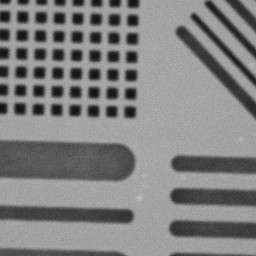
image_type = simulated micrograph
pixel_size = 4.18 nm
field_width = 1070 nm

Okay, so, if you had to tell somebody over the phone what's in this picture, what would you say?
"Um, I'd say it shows groups of lines, slits or small figures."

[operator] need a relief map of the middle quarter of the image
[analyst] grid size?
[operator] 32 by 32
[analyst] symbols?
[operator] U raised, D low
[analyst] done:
UUUUUUUUUUUUUUUUUUUUUUUUUUUUUUUU
UDDDDUDDDUUDDUUUDDUUUUUUUUUUUUUU
UDDDDUDDDUUDDDUDDDUUUUUUUUUUUUUU
UUDDUUDDDUUDDDUDDDUUUUUUUUUUUUUU
UUUUUUUUUUUUUUUUUUUUUUUUUUUUUUUU
UUDUUUUUUUUUUUUUUUUUUUUUUUUUUUUU
UDDDUUDDDUDDDDUDDDUUUUUUUUUUUUUU
UDDDUUDDDUDDDDUDDDUUUUUUUUUUUUUU
UUDDUUDDUUUDDUUDDDUUUUUUUUUUUUUU
UUUUUUUUUUUUUUUUUUUUUUUUUUUUUUUU
UDDDUUDDDUUDDUUDDUUUUUUUUUUUUUUU
UDDDUUDDDUDDDUUDDDUUUUUUUUUUUUUU
UDDDUUDDDUDDDUUDDDUUUUUUUUUUUUUU
UUUUUUUUUUUUUUUDDUUUUUUUUUUUUUUU
UUUUUUUUUUUUUUUUUUUUUUUUUUUUUUUU
UUUUUUUUUUUUUUUUUUUUUUUUUUUUUUUU
UUUUUUUUUUUUUUUUUUUUUUUUUUUUUUUU
UUUUUUUUUUUUUUUUUUUUUUUUUUUUUUUU
UUUUUUUUUUUUUUUUUUUUUUUUUUUUUUUU
DDDDDDDUUUUUUUUUUUUUUUUUUUUUUUUU
DDDDDDDDDDDDDDDDUUUUUUUUUUUUUUUU
DDDDDDDDDDDDDDDDDUUUUUUUUUUUUUUU
DDDDDDDDDDDDDDDDDUUUUUUUUUUUUUUU
DDDDDDDDDDDDDDDDDDUUUUUUUUUDDDDD
DDDDDDDDDDDDDDDDDDUUUUUUUUUDDDDD
DDDDDDDDDDDDDDDDDDUUUUUUUUUDDDDD
DDDDDDDDDDDDDDDDDUUUUUUUUUUDDDDD
DDDDDDDDDDDDDDDDDUUUUUUUUUUUUUUU
DDDDDDDDDDDDDDDDUUUUUUUUUUUUUUUU
UUUUUUUUUUUUUUUUUUUUUUUUUUUUUUUU
UUUUUUUUUUUUUUUUUUUUUUUUUUUUUUUU
UUUUUUUUUUUUUUUUUUUUUUUUUUUDDDDD